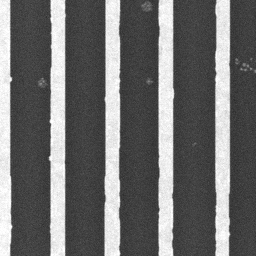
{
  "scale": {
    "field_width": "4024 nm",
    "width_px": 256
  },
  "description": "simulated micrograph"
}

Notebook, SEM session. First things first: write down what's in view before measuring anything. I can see lines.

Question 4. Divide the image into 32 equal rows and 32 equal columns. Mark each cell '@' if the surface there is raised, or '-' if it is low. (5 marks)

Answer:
@-----@@-----@@-----@@-----@@---
@-----@@-----@@-----@@-----@@---
@-----@@-----@@-----@@-----@@---
@------@-----@@-----@@-----@@---
@------@-----@@-----@@-----@@---
@-----@@-----@@-----@@-----@@---
@------@-----@@-----@@-----@@---
@------@-----@@-----@@-----@@---
@-----@@-----@@-----@@-----@@---
@-----@@-----@@-----@@-----@@---
@-----@@-----@@-----@@-----@@---
@-----@@-----@@-----@@-----@@---
@-----@@-----@@-----@@-----@@---
@-----@@-----@@-----@@-----@@---
@-----@@-----@@-----@@-----@@---
@-----@@-----@@-----@@-----@@---
@-----@@-----@@-----@@-----@@---
@-----@@-----@@-----@@-----@@---
@-----@@-----@@-----@@-----@@---
@-----@@-----@@-----@@-----@@---
@-----@@-----@@-----@@-----@@---
@-----@@-----@@-----@@-----@@---
@-----@@-----@@-----@@-----@@---
@-----@@-----@@-----@@-----@@---
@-----@@-----@@-----@@-----@@---
@-----@@-----@@-----@@-----@@---
@-----@@-----@@-----@@-----@@---
@-----@@-----@@-----@@-----@@---
@-----@@-----@@-----@@-----@@---
@-----@@-----@@-----@@-----@@---
@-----@@-----@@-----@------@@---
@-----@@-----@@-----@@-----@@---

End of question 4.